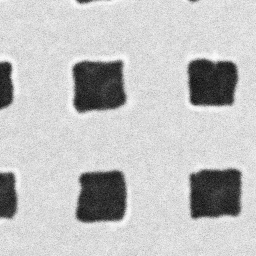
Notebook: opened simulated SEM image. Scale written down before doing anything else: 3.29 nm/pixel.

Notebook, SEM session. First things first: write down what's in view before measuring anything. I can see holes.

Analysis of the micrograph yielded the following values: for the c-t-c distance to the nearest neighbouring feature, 366 nanometers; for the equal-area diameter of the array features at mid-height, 183 nanometres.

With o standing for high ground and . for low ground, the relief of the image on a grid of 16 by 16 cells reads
oooooooooooooooo
oooooooooooooooo
oooooooooooooooo
oooooooooooooooo
.oooo...oooo...o
.oooo...oooo...o
.oooo...oooo..oo
oooooooooooooooo
oooooooooooooooo
oooooooooooooooo
oooooooooooooooo
.oooo...oooo...o
.oooo...oooo...o
.oooo...oooo...o
oooooooooooooooo
oooooooooooooooo